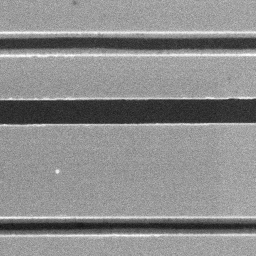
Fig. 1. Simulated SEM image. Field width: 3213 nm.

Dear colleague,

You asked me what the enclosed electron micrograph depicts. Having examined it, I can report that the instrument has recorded lines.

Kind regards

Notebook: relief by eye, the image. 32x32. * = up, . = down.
********************************
********************************
********************************
********************************
................................
................................
................................
********************************
********************************
********************************
********************************
********************************
................................
................................
................................
...................*************
********************************
********************************
********************************
********************************
********************************
********************************
********************************
********************************
********************************
********************************
********************************
................................
................................
********************************
********************************
********************************